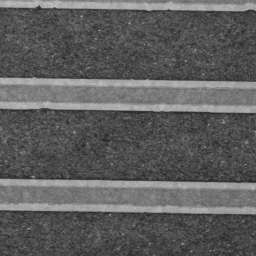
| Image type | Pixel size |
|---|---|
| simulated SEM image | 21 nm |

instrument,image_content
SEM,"one or a few lines or trenches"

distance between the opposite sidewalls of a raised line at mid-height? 504 nanometres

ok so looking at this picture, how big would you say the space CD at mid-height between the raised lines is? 77 pixels